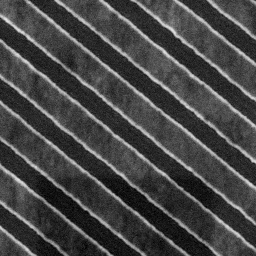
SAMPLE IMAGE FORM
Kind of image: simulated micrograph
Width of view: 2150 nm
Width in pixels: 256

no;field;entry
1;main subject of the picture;lines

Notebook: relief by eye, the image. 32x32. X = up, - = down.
XXXX---XXXXXX----XXXXXX----XXXXX
XXXXX----XXXXXX---XXXXXX---XXXXX
-XXXXX----XXXXXX----XXXXX----XXX
--XXXXXX---XXXXXX----XXXXX----XX
---XXXXXX----XXXXX----XXXXXX---X
X---XXXXXX----XXXXX----XXXXXX---
XX----XXXXX----XXXXXX----XXXXX--
XXX----XXXXX----XXXXXX----XXXXX-
XXXX----XXXXXX---XXXXXX----XXXXX
XXXXXX---XXXXXX----XXXXX----XXXX
-XXXXXX----XXXXX----XXXXXX---XXX
--XXXXXX----XXXXX----XXXXXX---XX
----XXXXX----XXXXXX---XXXXXX----
X----XXXXX----XXXXXX---XXXXXX---
XX----XXXXXX---XXXXXX----XXXXXX-
XXX----XXXXXX----XXXXX----XXXXXX
XXXXX---XXXXXX----XXXXXX---XXXXX
XXXXXX----XXXXX----XXXXXX---XXXX
-XXXXXX----XXXXXX---XXXXXX----XX
---XXXXX----XXXXXX---XXXXXX----X
----XXXXXX---XXXXXX----XXXXX----
X----XXXXXX---XXXXXX----XXXXX---
XX----XXXXXX----XXXXX----XXXXXX-
XXXX---XXXXXX----XXXXXX---XXXXXX
XXXXX----XXXXXX---XXXXXX----XXXX
XXXXXX----XXXXXX---XXXXXX----XXX
-XXXXXX----XXXXXX----XXXXX----XX
---XXXXX----XXXXXX----XXXXX----X
----XXXXXX----XXXXX----XXXXXX---
X----XXXXXX----XXXXXX---XXXXXX--
XXX----XXXXX----XXXXXX----XXXXX-
XXXX----XXXXX----XXXXXX----XXXXX